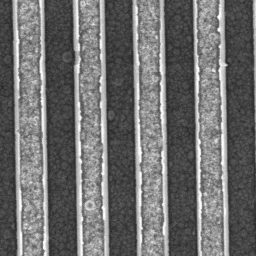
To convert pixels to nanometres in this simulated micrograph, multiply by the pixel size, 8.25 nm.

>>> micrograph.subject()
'parallel lines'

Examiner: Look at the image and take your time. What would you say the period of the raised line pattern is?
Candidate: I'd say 495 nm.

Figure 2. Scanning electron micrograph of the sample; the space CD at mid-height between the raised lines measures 0.261 micrometres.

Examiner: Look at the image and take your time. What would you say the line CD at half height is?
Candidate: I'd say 230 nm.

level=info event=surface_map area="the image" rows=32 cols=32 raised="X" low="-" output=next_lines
--XXX----XXXX----XXX----XXXX----
--XXX----XXXX----XXX----XXXX----
--XXX----XXXX----XXX----XXXX----
--XXX----XXXX----XXX----XXXX----
--XXX----XXXX----XXX----XXXX----
--XXX----XXXX----XXX----XXXX----
--XXX----XXXX----XXX----XXXX----
--XXX-----XXX----XXX----XXXX----
--XXX----XXXX----XXX----XXXX----
--XXX----XXXX----XXX----XXXX----
--XXX-----XXX----XXX----XXXX----
--XXX-----XXX----XXX-----XXX----
--XXX-----XXX----XXX-----XXX----
--XXXX----XXX----XXX-----XXX----
--XXXX----XXX----XXXX----XXX----
--XXXX----XXX----XXXX----XXX----
--XXXX----XXX----XXXX----XXX----
--XXXX----XXX----XXXX----XXX----
--XXXX----XXX----XXXX----XXX----
--XXXX----XXX----XXXX----XXX----
--XXXX----XXX----XXXX----XXX----
--XXXX----XXX----XXXX----XXX----
--XXXX----XXX----XXXX----XXX----
--XXXX----XXX----XXXX----XXX----
--XXXX----XXX----XXXX----XXX----
--XXXX----XXX----XXXX----XXX----
--XXXX----XXX----XXXX----XXX----
--XXXX----XXX----XXXX----XXX----
--XXXX----XXX----XXXX----XXX----
--XXXX----XXX----XXXX----XXX----
--XXXX----XXX----XXXX----XXX----
--XXXX----XXX----XXXX----XXX----